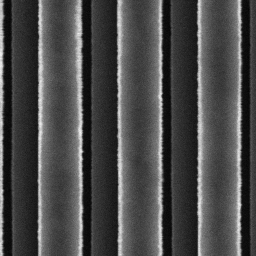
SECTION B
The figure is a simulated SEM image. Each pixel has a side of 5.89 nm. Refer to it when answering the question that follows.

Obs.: lines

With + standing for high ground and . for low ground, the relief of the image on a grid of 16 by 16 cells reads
..+++..+++..+++.
..+++..+++..+++.
..+++..+++..+++.
..+++..+++..+++.
..+++..+++..+++.
..+++..+++..+++.
..+++..+++..+++.
..+++..+++..+++.
..+++..+++..+++.
..+++..+++..+++.
..+++..+++..+++.
..+++..+++..+++.
..+++..+++..+++.
..+++..+++..+++.
..+++..+++..+++.
..+++..+++..+++.